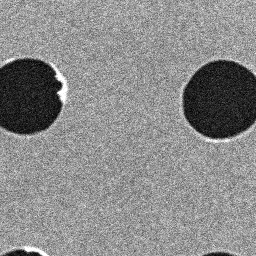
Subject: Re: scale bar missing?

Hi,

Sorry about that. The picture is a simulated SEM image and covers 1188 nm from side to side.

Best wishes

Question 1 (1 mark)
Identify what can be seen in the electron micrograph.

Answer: holes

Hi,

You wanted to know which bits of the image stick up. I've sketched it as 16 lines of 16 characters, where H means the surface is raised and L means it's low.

HHHHHHHHHHHHHHHH
HHHHHHHHHHHHHHHH
HHHHHHHHHHHHHHHH
HHHHHHHHHHHHHHHH
LLLHHHHHHHHHLLLL
LLLLHHHHHHHHLLLL
LLLLHHHHHHHLLLLL
LLLHHHHHHHHHLLLL
HHHHHHHHHHHHHLLH
HHHHHHHHHHHHHHHH
HHHHHHHHHHHHHHHH
HHHHHHHHHHHHHHHH
HHHHHHHHHHHHHHHH
HHHHHHHHHHHHHHHH
HHHHHHHHHHHHHHHH
HHHHHHHHHHHHHHHH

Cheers